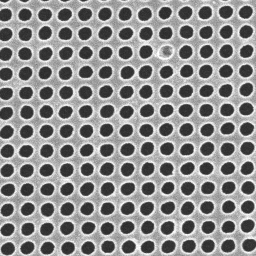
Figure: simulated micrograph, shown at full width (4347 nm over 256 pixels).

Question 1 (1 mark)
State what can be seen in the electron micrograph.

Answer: a regular array of holes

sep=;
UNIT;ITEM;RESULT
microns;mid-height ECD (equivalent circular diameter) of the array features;0.232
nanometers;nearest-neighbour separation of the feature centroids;324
